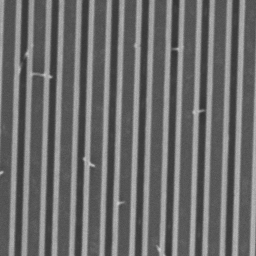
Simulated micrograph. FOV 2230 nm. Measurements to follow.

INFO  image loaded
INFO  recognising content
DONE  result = parallel lines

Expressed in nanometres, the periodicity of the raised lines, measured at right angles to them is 130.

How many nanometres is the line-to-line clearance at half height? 106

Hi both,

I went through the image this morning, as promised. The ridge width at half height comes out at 0.0414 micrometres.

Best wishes